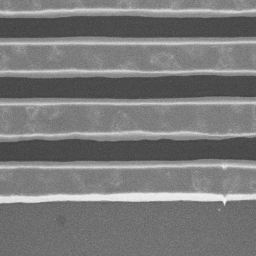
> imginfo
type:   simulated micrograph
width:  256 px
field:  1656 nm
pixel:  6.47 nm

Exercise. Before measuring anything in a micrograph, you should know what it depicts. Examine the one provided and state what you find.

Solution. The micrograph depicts one or a few lines or trenches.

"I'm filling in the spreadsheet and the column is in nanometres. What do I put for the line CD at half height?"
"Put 217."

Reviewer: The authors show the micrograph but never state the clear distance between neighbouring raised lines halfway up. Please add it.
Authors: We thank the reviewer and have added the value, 0.179 um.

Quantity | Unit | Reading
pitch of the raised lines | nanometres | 400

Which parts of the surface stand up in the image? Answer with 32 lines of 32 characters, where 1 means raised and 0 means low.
11111111111111111111111111111111
11111111111111100011111111111111
00000000000000000000000000000000
00000000000000000000000000000000
00000000000000000000000000000000
11111111111111111111111111111111
11111111111111111111111111111111
11111111111111111111111111111111
11111111111111111111111111111111
00000000000000000000000000000000
00000000000000000000000000000000
00000000000000000000000000000000
00000000000000000000000000000000
11111111111111111111111111111111
11111111111111111111111111111111
11111111111111111111111111111111
11111111111111111111111111111111
00000000000000000000000000000000
00000000000000000000000000000000
00000000000000000000000000000000
00000000000000000000001111111111
11111111111111111111111111111111
11111111111111111111111111111111
11111111111111111111111111111111
11111111110011111111100111111111
00000000000000000000000000000000
00000000000000000000000000000000
00000000000000000000000000000000
00000000000000000000000000000000
00000000000000000000000000000000
00000000000000000000000000000000
00000000000000000000000000000000